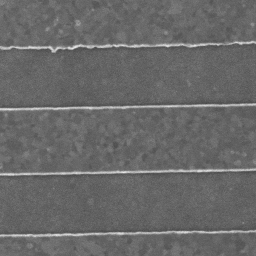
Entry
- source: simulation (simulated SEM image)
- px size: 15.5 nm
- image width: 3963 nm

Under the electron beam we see one or a few lines or trenches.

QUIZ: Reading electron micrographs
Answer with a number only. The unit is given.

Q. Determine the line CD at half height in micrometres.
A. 1.01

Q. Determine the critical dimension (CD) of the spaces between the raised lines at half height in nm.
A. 931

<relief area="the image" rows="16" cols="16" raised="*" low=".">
****************
****************
****************
................
................
................
................
****************
****************
****************
****************
................
................
................
............*.**
****************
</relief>